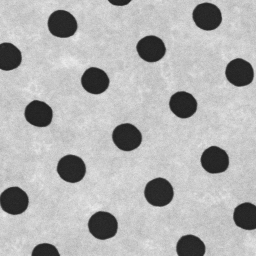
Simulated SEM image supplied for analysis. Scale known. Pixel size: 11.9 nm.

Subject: a regular array of holes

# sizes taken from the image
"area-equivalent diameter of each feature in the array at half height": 333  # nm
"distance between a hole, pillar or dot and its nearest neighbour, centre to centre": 765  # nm